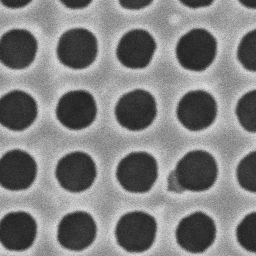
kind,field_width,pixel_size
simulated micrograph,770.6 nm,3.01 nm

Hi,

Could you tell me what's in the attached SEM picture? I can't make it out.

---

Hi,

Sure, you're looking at a regular array of holes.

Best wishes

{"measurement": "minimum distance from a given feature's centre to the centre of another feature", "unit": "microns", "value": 0.179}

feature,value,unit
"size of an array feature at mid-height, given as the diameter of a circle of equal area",127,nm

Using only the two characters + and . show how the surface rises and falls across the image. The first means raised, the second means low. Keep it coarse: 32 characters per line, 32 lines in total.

....++++...++++....++++...++++..
++++++++++++++++++++++++++++++++
++++++++++++++++++++++++++++++++
+++++++++..+++++++++++++.+++++++
....++++....+++....++++....+++..
.....++.....+++.....++.....+++..
.....++.....++.....+++.....+++..
....+++.....+++....+++.....+++..
+..++++++..+++++..+++++...++++..
++++++++++++++++++++++++++++++++
++++++++++++++++++++++++++++++++
+..+++++...+++++...+++++..+++++.
....+++.....+++....+++.....+++..
.....++.....++......++.....++...
.....++.....++.....+++.....++...
....++++...++++....++++...++++..
+++++++++++++++++++++++++++++++.
++++++++++++++++++++++++++++++++
++++++++++++++++++++++++++++++++
....++++...+++++...++++....++++.
.....++.....+++.....++.....+++..
.....++.....++......++.....++...
....+++.....+++.....++.....+++..
+...++++...++++....++++...++++..
++++++++++++++++++++++++++++++++
++++++++++++++++++++++++++++++++
++.++++++..+++++..++++++.+++++++
....++++....+++....++++....+++..
.....++.....++......++.....+++..
.....++.....++.....+++.....+++..
....+++....++++....+++.....+++..
++++++++++++++++..++++++.++++++.